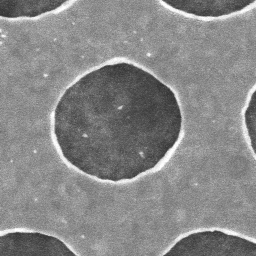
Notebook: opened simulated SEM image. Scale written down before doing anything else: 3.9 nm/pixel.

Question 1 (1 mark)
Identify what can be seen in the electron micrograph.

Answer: holes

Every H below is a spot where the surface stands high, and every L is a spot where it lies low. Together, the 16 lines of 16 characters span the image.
LLLLHHHHHHHLLLLH
HHHHHHHHHHHHHHHH
HHHHHHHHHHHHHHHH
HHHHHHHHHHHHHHHH
HHHHHHLLLHHHHHHH
HHHHLLLLLLLHHHHH
HHHHLLLLLLLHHHHH
HHHLLLLLLLLHHHHL
HHHLLLLLLLLHHHHL
HHHHLLLLLLLHHHHH
HHHHHLLLLLHHHHHH
HHHHHHHHHHHHHHHH
HHHHHHHHHHHHHHHH
HHHHHHHHHHHHHHHH
HHHHHHHHHHHHLLHH
LLLLHHHHHHHLLLLL